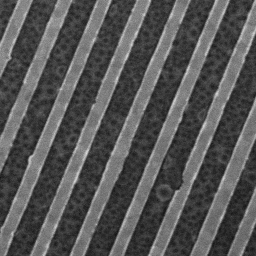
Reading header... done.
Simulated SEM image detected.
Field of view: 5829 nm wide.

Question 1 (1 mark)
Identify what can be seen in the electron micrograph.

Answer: parallel lines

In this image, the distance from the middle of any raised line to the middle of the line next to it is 833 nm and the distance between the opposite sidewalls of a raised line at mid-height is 12.6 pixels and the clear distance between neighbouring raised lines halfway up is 0.554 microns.